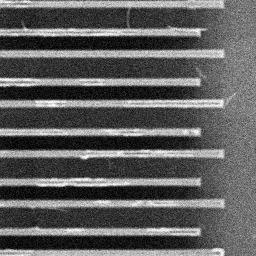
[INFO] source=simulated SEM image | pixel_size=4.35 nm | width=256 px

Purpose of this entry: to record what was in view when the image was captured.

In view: parallel lines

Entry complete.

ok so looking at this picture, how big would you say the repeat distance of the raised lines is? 108 nm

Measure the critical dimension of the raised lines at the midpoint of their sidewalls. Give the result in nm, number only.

31